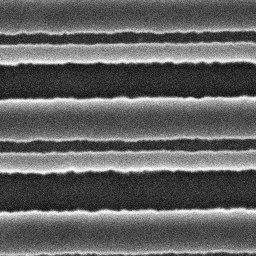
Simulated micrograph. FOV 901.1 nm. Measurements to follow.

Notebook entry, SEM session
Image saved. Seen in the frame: lines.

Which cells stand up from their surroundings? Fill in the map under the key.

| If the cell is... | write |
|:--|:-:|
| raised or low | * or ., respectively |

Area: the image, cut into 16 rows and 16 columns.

****************
****************
****************
****************
................
................
****************
****************
****************
****************
****************
................
................
****************
****************
****************